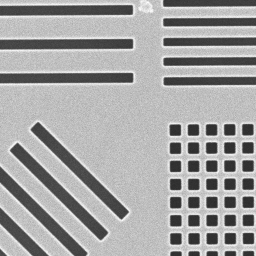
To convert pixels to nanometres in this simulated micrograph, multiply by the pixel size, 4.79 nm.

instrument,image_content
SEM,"groups of lines, slits or small figures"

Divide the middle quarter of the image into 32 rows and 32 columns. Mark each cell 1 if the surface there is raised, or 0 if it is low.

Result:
11111111111111111111111110000000
11111111111111111111111111111111
00000000000000000111111111111111
00000000000000000111111110000000
00000000000000000111111110000000
11111111111111111111111111111111
11111111111111111111111111111111
11111111111111111111111111111111
11111111111111111111111111111111
11111111111111111111111111111111
11111111111111111111111111111111
11111111111111111111111111111111
11111111111111111111111111111111
11111111111111111111111111111111
11111111111111111111111111111111
11111111111111111111111111000110
11111111111111111111111111000110
11111111111111111111111111000110
11111111111111111111111111111111
11111111111111111111111111111111
11111111111111111111111111000110
01111111111111111111111111000110
00111111111111111111111111100110
00011111111111111111111111111111
00001111111111111111111111100110
10000111111111111111111111000110
11000011111111111111111111100110
11100001111111111111111111111111
11110000111111111111111111111111
11111000011111111111111111000110
11111100001111111111111111000110
11111110000111111111111111100110